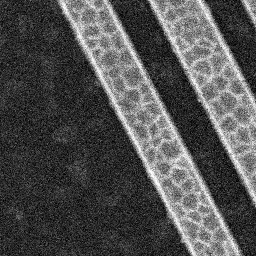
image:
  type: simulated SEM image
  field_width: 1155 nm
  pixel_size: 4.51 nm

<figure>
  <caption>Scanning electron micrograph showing one or a few lines or trenches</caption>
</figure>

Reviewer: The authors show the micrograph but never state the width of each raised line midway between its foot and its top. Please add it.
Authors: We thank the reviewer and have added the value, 178 nm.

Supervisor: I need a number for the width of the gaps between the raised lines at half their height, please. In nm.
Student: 182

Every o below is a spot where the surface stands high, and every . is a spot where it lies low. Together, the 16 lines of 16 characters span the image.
....ooo...ooo...
.....oo...ooo...
.....ooo...ooo..
......oo...ooo..
......ooo...ooo.
.......oo...ooo.
.......ooo...ooo
........oo...ooo
........ooo...oo
.........ooo..oo
.........ooo...o
..........ooo..o
..........ooo...
...........ooo..
...........ooo..
............ooo.